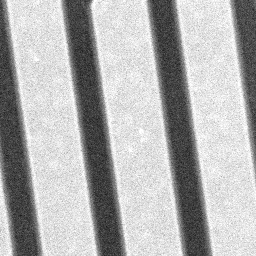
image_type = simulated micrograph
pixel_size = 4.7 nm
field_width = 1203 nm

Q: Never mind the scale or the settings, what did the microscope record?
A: one or a few lines or trenches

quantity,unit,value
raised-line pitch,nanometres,394